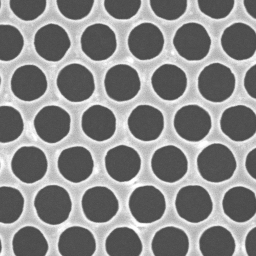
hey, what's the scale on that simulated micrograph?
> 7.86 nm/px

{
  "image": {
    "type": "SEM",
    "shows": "a regular array of holes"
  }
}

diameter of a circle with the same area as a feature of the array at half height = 0.292 um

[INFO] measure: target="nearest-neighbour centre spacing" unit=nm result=365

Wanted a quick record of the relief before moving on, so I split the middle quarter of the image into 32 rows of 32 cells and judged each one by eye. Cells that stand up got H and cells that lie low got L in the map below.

LLLLLHHHHHHHLLLLLHHHHHHHLLLLHHHH
LLLLLLHHHHHLLLLLLLHHHHHLLLLLLLHH
LLLLLLLHHHLLLLLLLLLHHHLLLLLLLLHH
LLLLLLLHHHLLLLLLLLLHHHLLLLLLLLLH
LLLLLLLLHHLLLLLLLLLHHHLLLLLLLLLH
LLLLLLLLHHLLLLLLLLLHHHLLLLLLLLLH
LLLLLLLLHHLLLLLLLLLHHHLLLLLLLLHH
LLLLLLLHHHHLLLLLLLHHHHHLLLLLLLHH
LLLLLLHHHHHHLLLLLHHHHHHHLLLLLHHH
HHLLHHHHHHHHHHLHHHHHHHHHHHHHHHHH
HHHHHHHLLLHHHHHHHHLLLLHHHHHHHHLL
HHHHHLLLLLLLHHHHHLLLLLLLHHHHHLLL
LHHHHLLLLLLLLHHHLLLLLLLLLHHHLLLL
LLHHLLLLLLLLLHHHLLLLLLLLLHHLLLLL
LLHHLLLLLLLLLHHHLLLLLLLLLHHLLLLL
LLHHLLLLLLLLLHHHLLLLLLLLLHHLLLLL
LHHHHLLLLLLLLHHHLLLLLLLLLHHHLLLL
LHHHHLLLLLLLLHHHHLLLLLLLHHHHLLLL
HHHHHHHLLLLLHHHHHHLLLLLHHHHHHHLL
HHHHHHHHHHHHHHHHHHHHHHHHHHHHHHHH
HHLLHHHHHHHHHLLLHHHHHHHHHLLLHHHH
LLLLLLHHHHHLLLLLLLHHHHHLLLLLLHHH
LLLLLLLHHHLLLLLLLLLHHHLLLLLLLLHH
LLLLLLLHHHLLLLLLLLLHHHLLLLLLLLLH
LLLLLLLHHHLLLLLLLLLHHHLLLLLLLLLH
LLLLLLLHHHLLLLLLLLLHHHLLLLLLLLLH
LLLLLLLHHHLLLLLLLLLHHHLLLLLLLLLH
LLLLLLLHHHHLLLLLLLLHHHLLLLLLLLHH
LLLLLLHHHHHHLLLLLHHHHHHHLLLLLHHH
HHLLHHHHHHHHHHLHHHHHHHHHHLLLHHHH
HHHHHHHHLHHHHHHHHHHHLLHHHHHHHHLL
HHHHHHLLLLLLHHHHHLLLLLLLHHHHHLLL